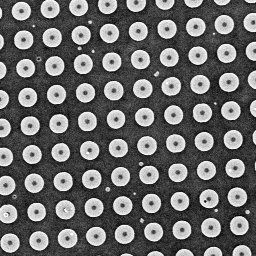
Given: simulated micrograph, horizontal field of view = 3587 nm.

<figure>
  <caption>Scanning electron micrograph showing an array of small figures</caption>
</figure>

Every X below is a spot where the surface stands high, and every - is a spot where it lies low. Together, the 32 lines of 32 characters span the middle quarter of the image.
---XXXX---XXXX---XXXX-----X-----
---XXXX----XX-------------------
--------------------------------
--------------------------XX----
-----------XX-----XXX----XXXX---
----XXX---XXXXX--XXXXX---XXXX---
---XXXXX--XXXXX--XXXXX---XXXX---
---XXXXX--XXXXX---XXXX----XX----
---XXXX----XXX------------------
-----X--------------------------
---------------------------X----
-------------------XXX---XXXX---
----XXX----XXXX---XXXX---XXXXX--
X---XXXX---XXXX---XXXX---XXXXX--
X---XXXX---XXXX---XXXX----XXX---
X---XXXX---XXX------X-----------
-----XX-------------------------
--------------------------------
-------------------XXX----XXXX--
-----XX-----XXX----XXXX---XXXX--
X---XXXX---XXXXX--XXXXX---XXXX--
X---XXXXX--XXXXX---XXXX---XXXX--
X---XXXXX---XXX-----XX----------
X----XXX------------------------
--------------------------------
---------------------------XXX--
-------------XXX---XXXX---XXXXX-
X----XXXX---XXXX---XXXXX--XXXXX-
XX---XXXX---XXXX---XXXX----XXX--
XX---XXXX---XXXX----XXX---------
XX---XXX------------------------
X-------------------------------